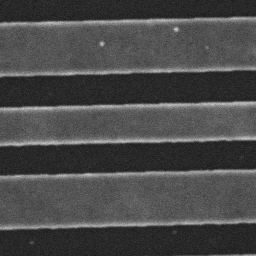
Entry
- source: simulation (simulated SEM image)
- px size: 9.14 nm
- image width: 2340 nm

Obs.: lines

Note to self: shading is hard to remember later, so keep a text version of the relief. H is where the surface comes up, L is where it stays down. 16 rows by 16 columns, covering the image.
LLLLLLLLLLLLLLLL
HHHHHHHHHHHHHHHH
HHHHHHHHHHHHHHHH
HHHHHHHHHHHHHHHH
HHHHHHHHHHHLLLLL
LLLLLLLLLLLLLLLL
LLLLLLLLLLHHHHHH
HHHHHHHHHHHHHHHH
HHHHHHHHHHHHHHHH
LLLLLLLLLLLLLLLL
LLLLLLLLLLLLLLLL
HHHHHHHHHHHHHHHH
HHHHHHHHHHHHHHHH
HHHHHHHHHHHHHHHH
LLLLLLLLLLLLLLLL
LLLLLLLLLLLLLLLL